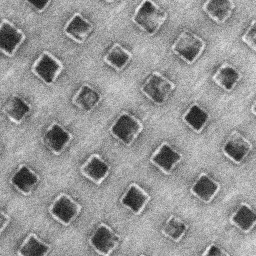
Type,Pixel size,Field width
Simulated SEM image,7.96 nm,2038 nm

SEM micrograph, a regular array of raised bodies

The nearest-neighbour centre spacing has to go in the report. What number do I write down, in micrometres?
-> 0.392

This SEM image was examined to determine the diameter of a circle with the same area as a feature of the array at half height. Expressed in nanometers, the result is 203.